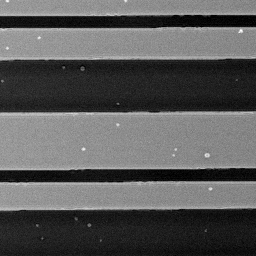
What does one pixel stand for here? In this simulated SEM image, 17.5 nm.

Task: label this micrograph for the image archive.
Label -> lines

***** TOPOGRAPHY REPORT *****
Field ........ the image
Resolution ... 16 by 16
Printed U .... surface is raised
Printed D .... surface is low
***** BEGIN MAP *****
UUUUUUUUUUUUUUUU
UUUUUUUUUUUUUUUU
UUUUUUUUUUUUUUUU
UUUUUUUUUUUUUUUU
DDDDDDDDDDDDDDDD
DDDDDDDDDDDDDDDD
DDDDDDDDDDDDDDDD
UUUUUUUUUUUUUUUU
UUUUUUUUUUUUUUUU
UUUUUUUUUUUUUUUU
UUUUUUUUUUUUUUUU
UUUUUUUUUUUUUUUU
UUUUUUUUUUUUUUUU
DDDDDDDDDDDDDDDD
DDDDDDDDDDDDDDDD
DDDDDDDDDDDDDDDD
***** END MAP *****